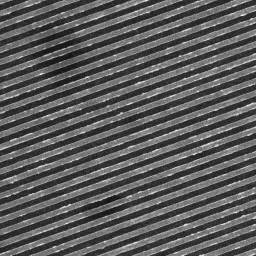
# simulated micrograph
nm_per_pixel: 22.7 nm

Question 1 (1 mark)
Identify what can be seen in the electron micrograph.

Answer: parallel lines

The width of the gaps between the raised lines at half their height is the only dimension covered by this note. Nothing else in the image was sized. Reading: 0.134 µm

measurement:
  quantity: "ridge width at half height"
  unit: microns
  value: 0.123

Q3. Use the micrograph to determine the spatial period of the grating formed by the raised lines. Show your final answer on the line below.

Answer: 260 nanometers